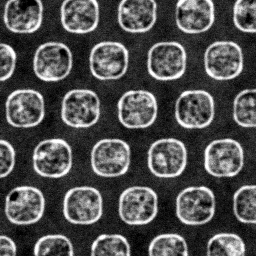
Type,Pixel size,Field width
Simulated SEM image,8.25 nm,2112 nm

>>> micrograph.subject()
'a regular array of raised bodies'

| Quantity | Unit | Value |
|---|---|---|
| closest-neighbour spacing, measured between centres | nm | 455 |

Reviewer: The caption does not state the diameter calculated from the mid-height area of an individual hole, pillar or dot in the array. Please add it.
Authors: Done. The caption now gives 36.9 px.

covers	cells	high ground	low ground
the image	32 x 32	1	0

01111000111100011110001111000011
01111000111100011110001111000111
01111000111100011110001111000111
01110000111100001100000111000011
00000000000000000000000000000000
00000000000000000000000000011000
11000111100011110001111000111100
11001111100111110001111000111100
11001111100011110001111000111100
10000111000011100001110000011000
00000000000000000000000000000000
00000000011000000000000000000001
01111000111100011110001111000011
01111000111100011110001111000111
01111000111100011110001111000111
00110000011000001100000111000011
00000000000000000000000000000000
00000000000000000000000000000000
10000111100011110001111000111100
11001111100011110001111000111100
11001111100011110001111000111100
10000111000011100001110000111100
00000000000000000000000000000000
00000000000000000000000000000001
01111000111100011110001111000111
01111000111100011110001111100111
01111000111100011110001111100111
00110000011100001110000111000011
00000000000000000000000000000000
00000000000000000000010000001000
11000111100011110001111000111100
11000111100011110001111000111100